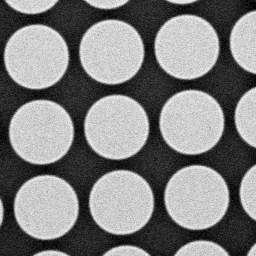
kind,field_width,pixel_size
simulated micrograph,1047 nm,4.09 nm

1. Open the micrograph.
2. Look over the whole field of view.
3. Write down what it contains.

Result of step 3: an array of small figures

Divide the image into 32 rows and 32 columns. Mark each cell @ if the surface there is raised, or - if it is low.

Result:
-@@@@@@----@@@@-----------------
---@@--------------------------@
---------------------@@@@-----@@
---@@@-----@@@@@@---@@@@@@@--@@@
--@@@@@@---@@@@@@---@@@@@@@--@@@
-@@@@@@@--@@@@@@@@-@@@@@@@@--@@@
-@@@@@@@--@@@@@@@@-@@@@@@@@--@@@
-@@@@@@@--@@@@@@@@--@@@@@@@---@@
-@@@@@@@---@@@@@@---@@@@@@----@@
-@@@@@@@---@@@@@------@@@-------
---@@@@-------------------------
-----------------------@@------@
------------@@@@@----@@@@@@---@@
---@@@@@---@@@@@@@--@@@@@@@@--@@
--@@@@@@@--@@@@@@@--@@@@@@@@-@@@
-@@@@@@@@--@@@@@@@--@@@@@@@@-@@@
-@@@@@@@@--@@@@@@@@-@@@@@@@@--@@
-@@@@@@@@--@@@@@@@---@@@@@@----@
--@@@@@@@---@@@@@-----@@@@------
---@@@@@-----@@@----------------
--------------------------------
--------------@@------@@@@@----@
----@@@@----@@@@@@---@@@@@@@--@@
---@@@@@@---@@@@@@@--@@@@@@@--@@
--@@@@@@@--@@@@@@@@--@@@@@@@--@@
--@@@@@@@@-@@@@@@@@--@@@@@@@--@@
--@@@@@@@@-@@@@@@@@--@@@@@@@---@
--@@@@@@@---@@@@@@----@@@@@-----
---@@@@@@----@@@@------@@@------
----@@@-------------------------
------------------------@@@-----
-----@@-------@@@@----@@@@@@---@